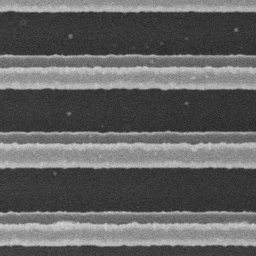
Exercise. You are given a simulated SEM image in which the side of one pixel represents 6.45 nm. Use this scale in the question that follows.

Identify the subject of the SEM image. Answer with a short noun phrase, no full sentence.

lines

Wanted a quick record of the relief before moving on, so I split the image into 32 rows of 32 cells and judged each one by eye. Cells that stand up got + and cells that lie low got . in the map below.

++++++++++++++++++++++++++++++++
................................
................................
................................
................................
................................
................................
++++++++++++++++++++++++++++++++
++++++++++++++++++++++++++++++++
++++++++++++++++++++++++++++++++
++++++++++++++++++++++++++++++++
................................
................................
................................
................................
................................
....................++..........
++++++++++++++++++++++++++++++++
++++++++++++++++++++++++++++++++
++++++++++++++++++++++++++++++++
++++++++++++++++++++++++++++++++
................................
................................
................................
................................
................................
.+..++.++....+++....++++.++++.+.
++++++++++++++++++++++++++++++++
++++++++++++++++++++++++++++++++
++++++++++++++++++++++++++++++++
++++++++++++++++++++++++++++++++
................................